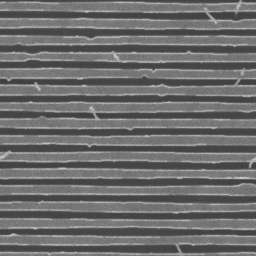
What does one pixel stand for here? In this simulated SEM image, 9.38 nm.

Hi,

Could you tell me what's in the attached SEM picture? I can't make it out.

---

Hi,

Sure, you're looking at parallel lines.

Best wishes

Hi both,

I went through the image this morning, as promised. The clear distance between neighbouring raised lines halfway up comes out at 58.6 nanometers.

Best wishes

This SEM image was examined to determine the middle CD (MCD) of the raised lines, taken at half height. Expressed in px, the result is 9.88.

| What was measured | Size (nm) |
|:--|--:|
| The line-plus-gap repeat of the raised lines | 156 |